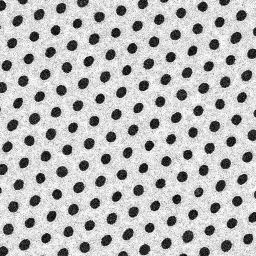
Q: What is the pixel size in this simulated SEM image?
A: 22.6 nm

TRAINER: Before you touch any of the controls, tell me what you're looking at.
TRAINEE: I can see a regular array of holes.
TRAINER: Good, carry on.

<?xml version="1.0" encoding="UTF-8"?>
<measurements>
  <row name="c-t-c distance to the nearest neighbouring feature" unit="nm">507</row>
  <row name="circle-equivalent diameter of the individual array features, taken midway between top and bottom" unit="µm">0.245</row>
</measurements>